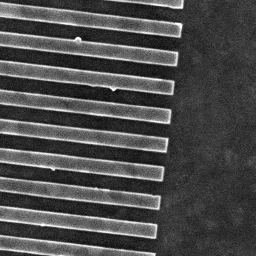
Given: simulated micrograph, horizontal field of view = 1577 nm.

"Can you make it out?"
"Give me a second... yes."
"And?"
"parallel lines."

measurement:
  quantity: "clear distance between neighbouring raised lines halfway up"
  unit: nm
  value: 90.3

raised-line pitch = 0.178 micrometres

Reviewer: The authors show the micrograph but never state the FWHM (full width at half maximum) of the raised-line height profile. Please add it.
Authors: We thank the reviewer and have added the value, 85 nanometers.